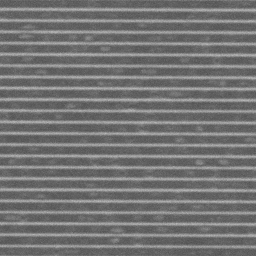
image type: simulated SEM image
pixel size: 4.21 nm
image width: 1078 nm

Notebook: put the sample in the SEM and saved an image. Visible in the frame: parallel lines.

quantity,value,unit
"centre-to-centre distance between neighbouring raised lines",0.0475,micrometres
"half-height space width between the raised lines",38.4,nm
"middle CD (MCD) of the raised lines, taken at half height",7.4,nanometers